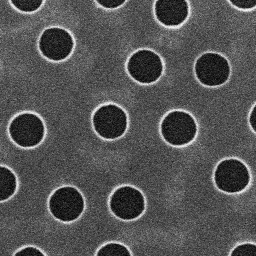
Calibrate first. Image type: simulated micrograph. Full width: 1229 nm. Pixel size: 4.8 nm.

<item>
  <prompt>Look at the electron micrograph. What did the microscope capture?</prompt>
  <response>a regular array of holes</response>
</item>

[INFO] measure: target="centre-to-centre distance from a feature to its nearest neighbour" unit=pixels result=67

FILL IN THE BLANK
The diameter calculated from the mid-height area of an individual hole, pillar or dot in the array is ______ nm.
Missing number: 168